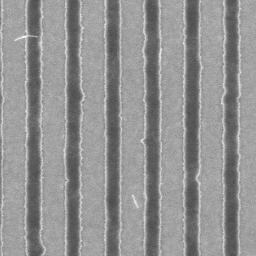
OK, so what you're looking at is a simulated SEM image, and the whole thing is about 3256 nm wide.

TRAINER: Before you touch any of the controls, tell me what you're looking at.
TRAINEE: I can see parallel lines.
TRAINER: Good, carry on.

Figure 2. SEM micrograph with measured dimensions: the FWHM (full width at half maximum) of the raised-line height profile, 202 nm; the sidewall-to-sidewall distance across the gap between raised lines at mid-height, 299 nanometers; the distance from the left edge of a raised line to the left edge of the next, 502 nm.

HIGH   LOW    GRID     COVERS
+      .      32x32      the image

...++...++...++...++...++...++..
...++...++...++...++...++...++..
...++...++...++...++...++...++..
...++...++...++...++...++...++..
...++...++...++...++...++...++..
...++...++...++...++...++...++..
...++...++...++...++...++...++..
...++...++...++...++...++...++..
...++...++...++...++...++...++..
...++...++...++...++...++...++..
...++...++...++...++...++...++..
...++...++...++...++...++...++..
...++...++...++...++...++...++..
...++...++...++...++...++...++..
...++...++...++...++...++...++..
...++...++...++...++...++...++..
...++...++...++...++...++...++..
...++...++...++...++...++...++..
...++...++...++...++...++...++..
...++...++...++...++...++...++..
...++...++...++...++...++...++..
...++...++...++...++...++...++..
...++...++...++...++...++...++..
...++...++...++...++...++...++..
...++...++...++...++...++...++..
...++...++...++...++...++...++..
...++...++...++...++...++...++..
...++...++...++...++...++...++..
...++...++...++...++...++...++..
...++...++...++...++...++...++..
...++...++...++...++...++...++..
...+++..++...++...++...++...++..